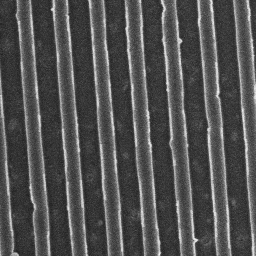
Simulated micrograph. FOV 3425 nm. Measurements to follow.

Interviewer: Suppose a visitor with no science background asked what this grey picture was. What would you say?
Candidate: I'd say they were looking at parallel lines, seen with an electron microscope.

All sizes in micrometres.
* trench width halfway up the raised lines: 0.283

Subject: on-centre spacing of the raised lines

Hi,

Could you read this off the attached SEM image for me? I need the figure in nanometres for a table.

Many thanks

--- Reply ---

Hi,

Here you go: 484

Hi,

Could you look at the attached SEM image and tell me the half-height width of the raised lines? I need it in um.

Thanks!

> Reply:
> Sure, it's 0.199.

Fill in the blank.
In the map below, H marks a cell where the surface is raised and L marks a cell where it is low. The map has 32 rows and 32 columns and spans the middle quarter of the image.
HHLLLLLLHHHLLLLLHHHHLLLLLLHHHLLL
HHLLLLLLHHHLLLLLHHHHLLLLLLHHHLLL
HHLLLLLLHHHLLLLLLHHHLLLLLLHHHLLL
HHLLLLLLHHHLLLLLLHHHLLLLLLHHHLLL
HHLLLLLLHHHLLLLLLHHHLLLLLLHHHHLL
HHLLLLLLHHHHLLLLLHHHHLLLLLHHHHLL
HHHLLLLLHHHHLLLLLHHHHLLLLLHHHHLL
HHHLLLLLHHHHLLLLLHHHHLLLLLHHHHLL
HHHLLLLLHHHHLLLLLHHHHLLLLLHHHHLL
HHHLLLLLHHHHLLLLLHHHHLLLLLHHHHLL
HHHLLLLLHHHHLLLLLHHHHLLLLLHHHHLL
HHHLLLLLHHHHLLLLLHHHHLLLLLHHHHLL
HHHLLLLLLHHHLLLLLHHHHLLLLLHHHHLL
HHHLLLLLLHHHLLLLLHHHHLLLLLHHHHLL
HHHLLLLLLHHHLLLLLHHHHLLLLLLHHHLL
HHHLLLLLLHHHLLLLLLHHHLLLLLLHHHLL
HHHLLLLLLHHHHLLLLLHHHLLLLLLHHHLL
HHHLLLLLLHHHHLLLLLHHHLLLLLLHHHHL
HHHLLLLLLHHHHLLLLLHHHLLLLLLHHHHL
HHHHLLLLLHHHHLLLLLHHHHLLLLHHHHHL
HHHHLLLLLHHHHLLLLLHHHHLLLLLHHHHL
HHHHLLLLLHHHHLLLLLHHHHLLLLLHHHHL
HHHHLLLLLHHHHLLLLLHHHHLLLLLHHHHL
HHHHLLLLLHHHHLLLLLHHHHLLLLLHHHHL
HHHHLLLLLHHHHLLLLLHHHHLLLLLHHHHL
HHHHLLLLLLHHHLLLLLHHHHLLLLLLHHHL
HHHHLLLLLLHHHLLLLLHHHHLLLLLLHHHL
HHHHLLLLLLHHHLLLLLHHHHLLLLLLHHHL
HHHHLLLLLLHHHLLLLLLHHHLLLLLLHHHL
LHHHLLLLLLHHHLLLLLLHHHLLLLLLHHHL
LHHHHLLLLLHHHLLLLLLHHHLLLLLLHHHL
LHHHHLLLLLHHHHLLLLLHHHHLLLLLHHHH